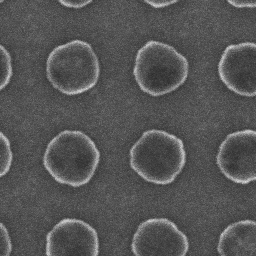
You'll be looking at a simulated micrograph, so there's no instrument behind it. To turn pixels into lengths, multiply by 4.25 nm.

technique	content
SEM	raised bodies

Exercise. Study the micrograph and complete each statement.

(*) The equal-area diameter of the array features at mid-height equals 221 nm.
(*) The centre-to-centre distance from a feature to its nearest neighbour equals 0.369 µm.